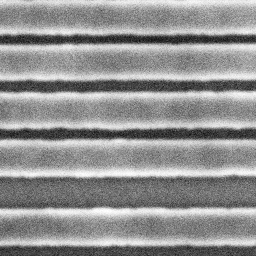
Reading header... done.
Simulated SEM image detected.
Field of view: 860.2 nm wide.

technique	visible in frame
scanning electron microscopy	lines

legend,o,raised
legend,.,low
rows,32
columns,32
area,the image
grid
oooooooooooooooooooooooooooooooo
oooooooooooooooooooooooooooooooo
oooooooooooooooooooooooooooooooo
oooooooooooooooooooooooooooooooo
................................
................................
oooooooooooooooooooooooooooooooo
oooooooooooooooooooooooooooooooo
oooooooooooooooooooooooooooooooo
oooooooooooooooooooooooooooooooo
................................
................................
oooooooooooooooooooooooooooooooo
oooooooooooooooooooooooooooooooo
oooooooooooooooooooooooooooooooo
oooooooooooooooooooooooooooooooo
................................
..............oo................
oooooooooooooooooooooooooooooooo
oooooooooooooooooooooooooooooooo
oooooooooooooooooooooooooooooooo
oooooooooooooooooooooooooooooooo
................................
................................
................................
................................
oooooooooooooooooooooooooooooooo
oooooooooooooooooooooooooooooooo
oooooooooooooooooooooooooooooooo
oooooooooooooooooooooooooooooooo
oooooooooooooo.ooooooo..oooooooo
................................